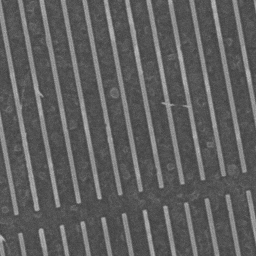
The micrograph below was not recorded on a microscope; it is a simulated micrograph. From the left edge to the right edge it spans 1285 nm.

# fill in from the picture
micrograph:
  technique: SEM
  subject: parallel lines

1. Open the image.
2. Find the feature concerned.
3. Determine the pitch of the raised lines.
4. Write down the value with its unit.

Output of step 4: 0.106 um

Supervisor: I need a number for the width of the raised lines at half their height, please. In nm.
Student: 17.3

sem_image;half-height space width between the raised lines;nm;87